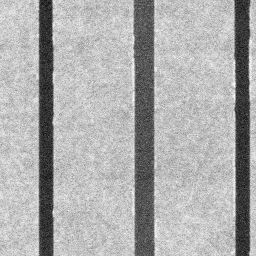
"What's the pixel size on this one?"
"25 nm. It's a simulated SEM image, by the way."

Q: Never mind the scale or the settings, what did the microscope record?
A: lines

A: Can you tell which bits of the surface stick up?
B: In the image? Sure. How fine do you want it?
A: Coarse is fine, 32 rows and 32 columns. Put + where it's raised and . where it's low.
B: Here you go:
+++++..++++++++++..++++++++++..+
+++++..++++++++++..++++++++++..+
+++++..++++++++++..++++++++++..+
+++++..++++++++++..++++++++++..+
+++++..++++++++++..++++++++++..+
+++++..++++++++++..++++++++++..+
+++++..++++++++++..++++++++++..+
+++++..++++++++++..++++++++++..+
+++++..++++++++++..++++++++++..+
+++++..++++++++++..++++++++++..+
+++++..++++++++++..++++++++++..+
+++++..++++++++++..++++++++++..+
+++++..++++++++++..++++++++++..+
+++++..++++++++++..++++++++++..+
+++++..++++++++++..++++++++++..+
+++++..++++++++++..++++++++++..+
+++++..++++++++++..++++++++++..+
+++++..++++++++++..++++++++++..+
+++++..++++++++++..++++++++++..+
+++++..++++++++++..++++++++++..+
+++++..++++++++++..++++++++++..+
+++++..++++++++++..++++++++++..+
+++++..++++++++++..++++++++++..+
+++++..++++++++++..++++++++++..+
+++++..++++++++++..++++++++++..+
+++++..++++++++++..++++++++++..+
+++++..++++++++++..++++++++++..+
+++++..++++++++++..++++++++++..+
+++++..++++++++++..++++++++++..+
+++++..++++++++++..++++++++++..+
+++++..++++++++++..++++++++++..+
+++++..++++++++++..++++++++++..+